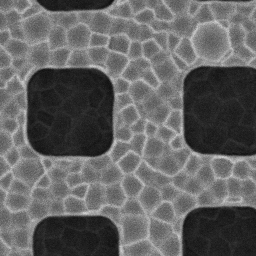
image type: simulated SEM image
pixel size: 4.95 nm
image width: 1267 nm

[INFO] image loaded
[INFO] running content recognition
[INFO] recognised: holes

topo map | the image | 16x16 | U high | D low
UUUDDDUUUUUUUUUU
UUUUUUUUUUUUUUUU
UUUUUUUUUUUUUUUU
UUUUUUUUUUUUUUUU
UUDDDDUUUUUUDDDD
UUDDDDDUUUUDDDDD
UUDDDDDUUUUDDDDD
UUDDDDDUUUUDDDDD
UUDDDDDUUUUDDDDD
UUDDDDDUUUUUDDDD
UUUUUUUUUUUUUUUU
UUUUUUUUUUUUUUUU
UUUUUUUUUUUUUUUU
UUUDDDUUUUUUDDDD
UUDDDDDUUUUDDDDD
UUDDDDDUUUUDDDDD